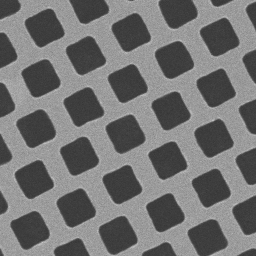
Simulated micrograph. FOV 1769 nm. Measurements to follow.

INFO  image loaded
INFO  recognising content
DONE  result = a regular array of holes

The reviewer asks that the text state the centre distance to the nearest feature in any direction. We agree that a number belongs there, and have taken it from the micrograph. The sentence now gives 345 nm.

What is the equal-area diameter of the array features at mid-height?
249 nanometers